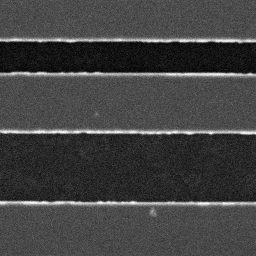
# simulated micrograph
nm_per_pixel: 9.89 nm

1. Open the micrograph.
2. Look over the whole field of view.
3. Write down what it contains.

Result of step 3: lines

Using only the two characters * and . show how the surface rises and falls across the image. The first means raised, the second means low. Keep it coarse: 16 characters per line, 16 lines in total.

****************
****************
****************
................
................
****************
****************
****************
................
................
................
................
................
****************
****************
****************